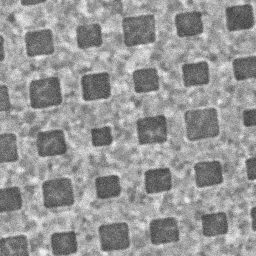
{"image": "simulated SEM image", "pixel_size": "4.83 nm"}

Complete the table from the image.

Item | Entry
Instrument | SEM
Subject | a regular array of holes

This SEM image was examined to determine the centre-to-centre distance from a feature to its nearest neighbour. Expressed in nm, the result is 243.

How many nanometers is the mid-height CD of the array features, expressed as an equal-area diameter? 152